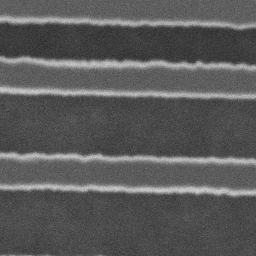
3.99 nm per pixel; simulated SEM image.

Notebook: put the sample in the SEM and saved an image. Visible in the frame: lines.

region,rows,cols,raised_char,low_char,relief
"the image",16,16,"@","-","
@@@@@@@@@@@@@@@@
-------@@@@@@@@@
----------------
----------------
@@@@@@@@@@@@@@@@
@@@@@@@@@@@@@@@@
----------------
----------------
----------------
----------------
@@@@@@@@@@@@@@@@
@@@@@@@@@@@@@@@@
----------------
----------------
----------------
----------------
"